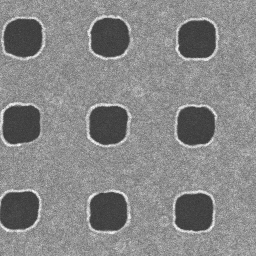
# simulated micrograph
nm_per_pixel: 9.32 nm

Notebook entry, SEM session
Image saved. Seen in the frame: a regular array of holes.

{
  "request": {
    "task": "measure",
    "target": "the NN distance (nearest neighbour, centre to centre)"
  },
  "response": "805 nm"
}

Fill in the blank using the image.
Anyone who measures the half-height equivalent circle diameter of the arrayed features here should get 0.375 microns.